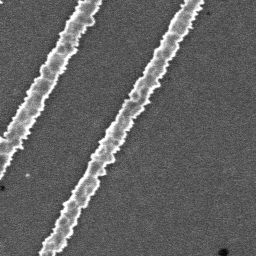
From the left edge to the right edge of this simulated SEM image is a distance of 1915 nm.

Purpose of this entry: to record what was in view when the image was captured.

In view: one or a few lines or trenches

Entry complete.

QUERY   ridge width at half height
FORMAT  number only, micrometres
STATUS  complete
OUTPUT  0.119